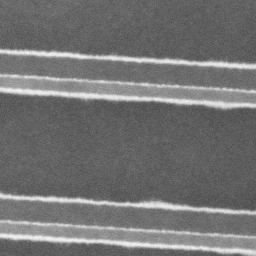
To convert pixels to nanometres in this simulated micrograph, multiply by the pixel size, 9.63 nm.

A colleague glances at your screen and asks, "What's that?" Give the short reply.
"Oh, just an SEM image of lines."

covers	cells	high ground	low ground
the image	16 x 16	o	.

................
................
................
oooo............
oooooooooooooooo
oooooooooooooooo
..............oo
................
................
................
................
................
ooo.............
oooooooooooooooo
oooooooooooooooo
............oooo